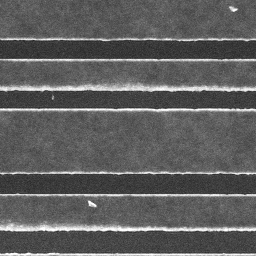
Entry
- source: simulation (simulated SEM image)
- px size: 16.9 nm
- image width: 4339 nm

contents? lines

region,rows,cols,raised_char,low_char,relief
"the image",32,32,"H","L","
HHHHHHHHHHHHHHHHHHHHHHHHHHHHHHHH
HHHHHHHHHHHHHHHHHHHHHHHHHHHHHHHH
HHHHHHHHHHHHHHHHHHHHHHHHHHHHHHHH
HHHHHHHHHHHHHHHHHHHHHHHHHHHHHHHH
HHHHHHHHHHHHHHHHHHHHHHHHHHHHHHHH
LLLLLLLLLLLLLLLLLLLLLLLLLLLLLLLL
LLLLLLLLLLLLLLLLLLLLLLLLLLLLLLLL
HHHHHHHHHHHHHHHHHHHHHHHHHHHHHHHH
HHHHHHHHHHHHHHHHHHHHHHHHHHHHHHHH
HHHHHHHHHHHHHHHHHHHHHHHHHHHHHHHH
HHHHHHHHHHHHHHHHHHHHHHHHHHHHHHHH
LLLLLLLLLLLLLLLLLLLLLLLLLLLLLLLL
LLLLLLLLLLLLLLLLLLLLLLLLLLLLLLLL
LLLLLLLLLLLLLLLLLLLLLLLLLLLLLLLL
HHHHHHHHHHHHHHHHHHHHHHHHHHHHHHHH
HHHHHHHHHHHHHHHHHHHHHHHHHHHHHHHH
HHHHHHHHHHHHHHHHHHHHHHHHHHHHHHHH
HHHHHHHHHHHHHHHHHHHHHHHHHHHHHHHH
HHHHHHHHHHHHHHHHHHHHHHHHHHHHHHHH
HHHHHHHHHHHHHHHHHHHHHHHHHHHHHHHH
HHHHHHHHHHHHHHHHHHHHHHHHHHHHHHHH
HHHHHHHHHHHHHHHHHHHHHHHHHHHHHHHH
LLLLLLLLLLLLLLLLLLLLLLLLLLLLLLLL
LLLLLLLLLLLLLLLLLLLLLLLLLLLLLLLL
HHHHHHHHHHHHHHHHHHHHHHHHHHHHHHHH
HHHHHHHHHHHHHHHHHHHHHHHHHHHHHHHH
HHHHHHHHHHHHHHHHHHHHHHHHHHHHHHHH
HHHHHHHHHHHHHHHHHHHHHHHHHHHHHHHH
HHHHHHHHHHHHHHHHHHHHHHHHHHHHHHHH
LLLLLLLLLLLLLLLLLLLLLLLLLLLLLLLL
LLLLLLLLLLLLLLLLLLLLLLLLLLLLLLLL
LLLLLLLLLLLLLLLLLLLLLLLLLLLLLLLL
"